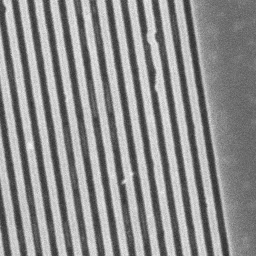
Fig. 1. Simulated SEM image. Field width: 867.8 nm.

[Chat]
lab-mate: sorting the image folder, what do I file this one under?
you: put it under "parallel lines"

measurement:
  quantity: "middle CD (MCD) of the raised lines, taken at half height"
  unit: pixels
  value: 8.02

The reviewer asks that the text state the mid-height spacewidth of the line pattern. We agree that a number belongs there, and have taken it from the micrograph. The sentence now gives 26.8 nanometers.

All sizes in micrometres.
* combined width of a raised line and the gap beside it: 0.0521